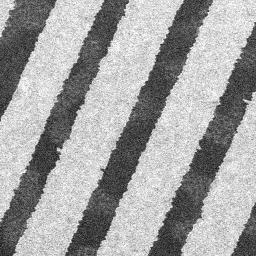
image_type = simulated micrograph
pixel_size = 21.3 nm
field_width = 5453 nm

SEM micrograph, one or a few lines or trenches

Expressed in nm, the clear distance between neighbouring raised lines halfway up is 602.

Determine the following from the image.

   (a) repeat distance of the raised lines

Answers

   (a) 1570 nm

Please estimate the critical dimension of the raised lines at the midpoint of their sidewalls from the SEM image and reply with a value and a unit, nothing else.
965 nm